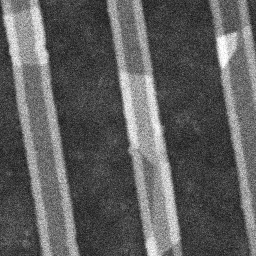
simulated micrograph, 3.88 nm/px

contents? one or a few lines or trenches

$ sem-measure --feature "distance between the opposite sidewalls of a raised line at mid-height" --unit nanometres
103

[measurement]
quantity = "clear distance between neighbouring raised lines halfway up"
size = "75.9 pixels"